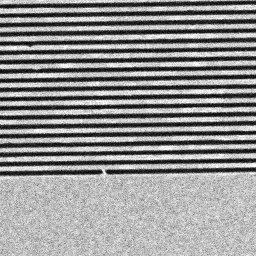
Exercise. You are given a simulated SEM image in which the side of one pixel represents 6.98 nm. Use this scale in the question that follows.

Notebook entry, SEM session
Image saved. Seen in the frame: parallel lines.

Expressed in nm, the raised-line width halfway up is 37.5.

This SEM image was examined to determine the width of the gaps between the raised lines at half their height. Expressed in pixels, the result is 4.5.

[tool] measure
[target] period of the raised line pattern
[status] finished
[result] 64.8 nm